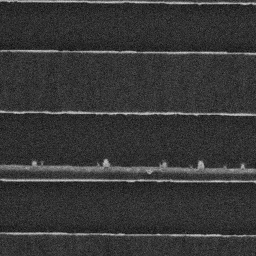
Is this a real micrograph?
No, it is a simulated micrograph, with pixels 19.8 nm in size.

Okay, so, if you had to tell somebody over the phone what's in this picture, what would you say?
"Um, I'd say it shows lines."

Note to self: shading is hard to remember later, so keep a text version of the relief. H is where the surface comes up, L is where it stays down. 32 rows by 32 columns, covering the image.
LLLLLLLLLLLLLLLLLLLLLLLLLLLLLLLL
LLLLLLLLLLLLLLLLLLLLLLLLLLLLLLLL
LLLLLLLLLLLLLLLLLLLLLLLLLLLLLLLL
LLLLLLLLLLLLLLLLLLLLLLLLLLLLLLLL
LLLLLLLLLLLLLLLLLLLLLLLLLLLLLLLL
LLLLLLLLLLLLLLLLLLLLLLLLLLLLLLLL
HHHHHHHHHHHHHHHHHLLLLLLLLLLLLLLL
HHHHHHHHHHHHHHHHHHHHHHHHHHHHHHHH
HHHHHHHHHHHHHHHHHHHHHHHHHHHHHHHH
HHHHHHHHHHHHHHHHHHHHHHHHHHHHHHHH
HHHHHHHHHHHHHHHHHHHHHHHHHHHHHHHH
HHHHHHHHHHHHHHHHHHHHHHHHHHHHHHHH
HHHHHHHHHHHHHHHHHHHHHHHHHHHHHHHH
HHHHHHHHHHHHHHHHHHHHHHHHHHHHHHHH
LLLLLLLLLLLLLLLLLLLLLLLLLLLLLLLL
LLLLLLLLLLLLLLLLLLLLLLLLLLLLLLLL
LLLLLLLLLLLLLLLLLLLLLLLLLLLLLLLL
LLLLLLLLLLLLLLLLLLLLLLLLLLLLLLLL
LLLLLLLLLLLLLLLLLLLLLLLLLLLLLLLL
LLLLLLLLLLLLLLLLLLLLLLLLLLLLLLLL
LLLLLLLLLLLLLLLLLLLLLLLLLLLLLLLL
HHHHHHHHHHHHHHHHHHHHHHHHHHHHHHHH
HHHHHHHHHHHHHHHHHHHHHHHHHHHHHHHH
LLLLLLLLLLLLLLLLLLLLLLLLLLLLLLLL
LLLLLLLLLLLLLLLLLLLLLLLLLLLLLLLL
LLLLLLLLLLLLLLLLLLLLLLLLLLLLLLLL
LLLLLLLLLLLLLLLLLLLLLLLLLLLLLLLL
LLLLLLLLLLLLLLLLLLLLLLLLLLLLLLLL
LLLLLLLLLLLLLLLLLLLLLLLLLLLLLLLL
HHHHHHHHHHHHHHHHHHHHHHHHHHHHLLLL
HHHHHHHHHHHHHHHHHHHHHHHHHHHHHHHH
HHHHHHHHHHHHHHHHHHHHHHHHHHHHHHHH